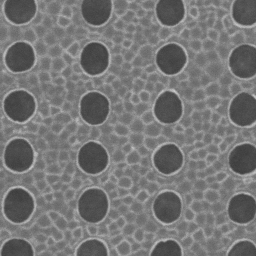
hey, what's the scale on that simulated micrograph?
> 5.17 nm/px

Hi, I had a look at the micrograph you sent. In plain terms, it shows a regular array of holes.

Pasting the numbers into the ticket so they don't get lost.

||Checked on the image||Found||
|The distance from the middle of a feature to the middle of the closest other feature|251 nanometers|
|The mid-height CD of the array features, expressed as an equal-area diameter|0.165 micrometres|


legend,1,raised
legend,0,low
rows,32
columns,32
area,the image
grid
10000111110000111111000111111000
10000111110000111110000111111000
10001111111001111111000111111000
11111111111111111111111111111111
11111111111111111111111111111111
11001111111001111111101111111111
10001111110000111111000111111000
10001111110000111110000111111000
10001111110001111111000111111000
11111111111111111111111111111000
11111111111111111111111111111111
10011111111111111111001111111111
00001111110001111111000111111000
00001111110000111110000111111000
10001111110000111110000111111000
11111111111011111111111111111000
11111111111111111111111111111111
10011111111111111111111111111111
10001111110001111111001111111000
00001111110000111110000111111000
10001111110000111110000111111000
11011111111001111111001111111000
11111111111111111111111111111111
11111111111011111111111111111111
10001111110001111111001111111001
00001111110000111110000111110000
00001111110001111110000111110000
10011111111001111111001111111000
11111111111111111111111111111111
11111111111111111111111111111111
10001111110001111111001111111000
00001111110001111110000111111000